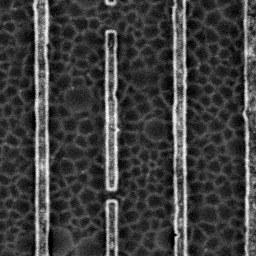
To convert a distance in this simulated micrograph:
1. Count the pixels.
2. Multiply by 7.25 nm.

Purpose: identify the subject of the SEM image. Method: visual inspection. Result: one or a few lines or trenches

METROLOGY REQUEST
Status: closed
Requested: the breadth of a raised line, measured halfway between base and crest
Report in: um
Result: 0.0734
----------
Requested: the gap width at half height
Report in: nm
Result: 434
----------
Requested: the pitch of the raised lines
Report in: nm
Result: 501